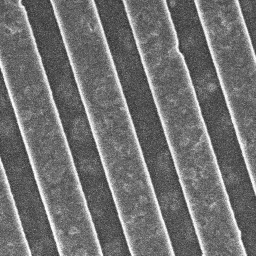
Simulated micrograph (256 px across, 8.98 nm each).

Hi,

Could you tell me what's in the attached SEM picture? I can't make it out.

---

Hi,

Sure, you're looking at one or a few lines or trenches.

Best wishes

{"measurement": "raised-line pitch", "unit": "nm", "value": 614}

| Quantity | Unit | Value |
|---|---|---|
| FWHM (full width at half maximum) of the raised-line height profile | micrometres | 0.358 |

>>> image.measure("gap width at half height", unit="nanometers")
253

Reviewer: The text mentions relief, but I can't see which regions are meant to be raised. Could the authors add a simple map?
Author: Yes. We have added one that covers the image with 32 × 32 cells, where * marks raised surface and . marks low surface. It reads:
***....*****....*****....*****..
***....*****....*****....*****..
****...*****....*****....*****..
****....*****...******...******.
****....*****....*****....*****.
****....*****....*****....*****.
*****...******...*****....******
*****....*****....*****....*****
*****....*****....*****....*****
******...******...******...*****
.*****....*****....*****....****
.*****....*****....*****....****
.******...******...******...****
..*****....*****....*****....***
..*****....*****....*****....***
..******...******...******...***
...*****....*****....*****....**
...*****....*****....*****....**
...******...******...*****....**
....*****....*****....*****...**
....*****....*****....*****....*
*...******...*****....*****....*
*....*****....*****...******...*
*....*****....*****....*****....
*....*****....*****....*****....
**....*****....*****...******...
**....*****....*****....*****...
**....*****....*****....*****...
***...******...******...******..
***....*****....*****....*****..
***....*****....*****....*****..
****...******...******...******.